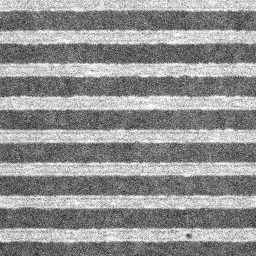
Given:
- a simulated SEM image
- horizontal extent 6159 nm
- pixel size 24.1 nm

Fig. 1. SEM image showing parallel lines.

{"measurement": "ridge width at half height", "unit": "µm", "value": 0.541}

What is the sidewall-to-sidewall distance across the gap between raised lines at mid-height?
250 nanometers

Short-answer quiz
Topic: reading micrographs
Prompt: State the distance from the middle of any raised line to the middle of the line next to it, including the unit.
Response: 0.793 µm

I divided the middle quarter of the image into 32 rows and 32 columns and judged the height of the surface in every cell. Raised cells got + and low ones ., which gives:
................................
................................
..............................+.
++++++++++++++++++++++++++++++++
++++++++++++++++++++++++++++++++
++++++++++++++++++++++++++++++++
++++++++++++++++++++++++++++++++
++++++++++++++++++++++++++++++++
................................
................................
................................
++++++++++++++++++++++++++++++++
++++++++++++++++++++++++++++++++
++++++++++++++++++++++++++++++++
++++++++++++++++++++++++++++++++
++++++++++++++++++++++++++++++++
++++++++++++++++++++++++++++++++
................................
................................
...........+++++++++++++++++++++
++++++++++++++++++++++++++++++++
++++++++++++++++++++++++++++++++
++++++++++++++++++++++++++++++++
++++++++++++++++++++++++++++++++
++++++++++++++++++++++++++++++++
................................
................................
................................
++++++++++++++++++++++++++++++++
++++++++++++++++++++++++++++++++
++++++++++++++++++++++++++++++++
++++++++++++++++++++++++++++++++